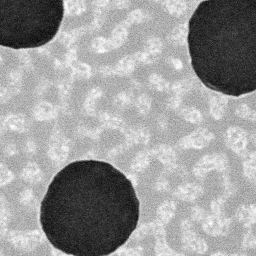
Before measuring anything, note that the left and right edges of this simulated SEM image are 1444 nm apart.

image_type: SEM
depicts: holes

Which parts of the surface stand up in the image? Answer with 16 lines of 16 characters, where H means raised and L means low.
LLLLHHHHHHHHLLLL
LLLLHHHHHHHHLLLL
LLLHHHHHHHHHLLLL
HHHHHHHHHHHHLLLL
HHHHHHHHHHHHLLLL
HHHHHHHHHHHHHLLL
HHHHHHHHHHHHHHHH
HHHHHHHHHHHHHHHH
HHHHHHHHHHHHHHHH
HHHHHHHHHHHHHHHH
HHHHLLLHHHHHHHHH
HHHLLLLLHHHHHHHH
HHHLLLLLLHHHHHHH
HHLLLLLLLHHHHHHH
HHHLLLLLHHHHHHHH
HHHHLLLHHHHHHHHH